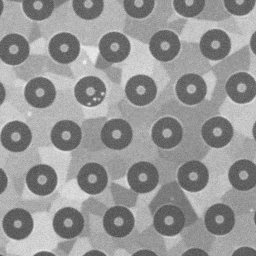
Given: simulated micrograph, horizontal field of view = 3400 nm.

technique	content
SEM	an array of small figures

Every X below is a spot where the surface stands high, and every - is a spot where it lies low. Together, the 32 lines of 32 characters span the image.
XXX----XX----XX----XXX----XX----
XXX----XX----XXX---XXX---XXXX--X
XXXX--XXXXXXXXXXXXXXXXXXXXXXXXXX
XXXXXXXXXXXXXXXXXXXXXXXXXXXXXXXX
X--XXXX--XXXX---XXX---XXX----XX-
----XX----XX----XXX----XX----XX-
----XX----XX----XXX---XXX----XX-
---XXXX--XXXX---XXXX--XXXX--XXXX
XXXXXXXXXXXXXXXXXXXXXXXXXXXXXXXX
XXXXXXXXXXX-XXXXX--XXXX--XXXX---
XXX----XX----XXX---XXX----XX----
-XX----XX----XXX----XX----XX----
-XX----XXX---XXX---XXX---XXXX---
XXXX--XXXXXXXXXXXXXXXXXXXXXXXXXX
XXXXXXXXXXXXXXXXXXXXXXXXXXXXXXXX
X--XXXX---XXX---XXX----XX----XXX
----XX----XXX----XX----XX----XX-
----XX----XXX---XXX----XX----XXX
X--XXXX---XXXX--XXXX--XXXXX-XXXX
XXXXXXXXXXXXXXXXXXXXXXXXXXXXXXXX
XXXXXXXXXXX--XXXX--XXXX--XXXX---
-XX----XXX---XXX----XX----XXX---
-XX----XXX----XX----XX----XXX---
-XX----XXX---XXX---XXXX---XXX---
XXXXX-XXXXXXXXXXXXXXXXXXXXXXXXXX
XXXXXXXXXXXXXXXXXXXXXXXXXXX-XXXX
X---XXX---XXX----XX----XXX---XXX
----XXX---XXX----XX----XX----XXX
----XXX---XXX----XX----XXX---XXX
X---XXX---XXXX--XXXX--XXXXX-XXXX
XXXXXXXXXXXXXXXXXXXXXXXXXXXXXXXX
XXXXX--XXXX--XXXX--XXXX---XXX---